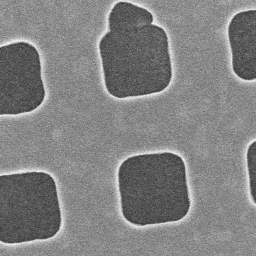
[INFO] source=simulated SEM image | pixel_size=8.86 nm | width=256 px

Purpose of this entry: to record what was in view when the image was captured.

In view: holes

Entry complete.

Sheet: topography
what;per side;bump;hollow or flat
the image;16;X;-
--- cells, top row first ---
XXXXXXX--XXXXXXX
XXXXXXX---XXXX--
XXXXXX----XXXX--
--XXXX-----XXX--
---XXX-----XXXX-
---XXXX---XXXXXX
--XXXXXXXXXXXXXX
XXXXXXXXXXXXXXXX
XXXXXXXXXXXXXXXX
XXXXXXXXXXXXXXX-
XXXXXXXX----XXX-
---XXXX-----XXXX
----XXXX----XXXX
----XXXX---XXXXX
---XXXXXXXXXXXXX
XXXXXXXXXXXXXXXX